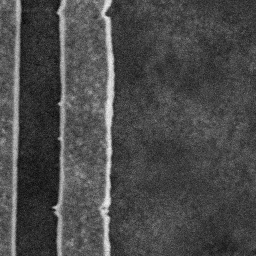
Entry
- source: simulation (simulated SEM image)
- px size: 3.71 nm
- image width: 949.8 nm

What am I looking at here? one or a few lines or trenches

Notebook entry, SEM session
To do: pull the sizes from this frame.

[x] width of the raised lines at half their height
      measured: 178 nm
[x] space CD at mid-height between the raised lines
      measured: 0.168 micrometres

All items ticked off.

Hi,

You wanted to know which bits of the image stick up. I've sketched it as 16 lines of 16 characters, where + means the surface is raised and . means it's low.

+...+++.........
+...+++.........
+...+++.........
+...+++.........
+...+++.........
+...+++.........
+...+++.........
+...+++.........
+...+++.........
+...+++.........
+...+++.........
+...+++.........
+...+++.........
+...+++.........
+...+++.........
+...+++.........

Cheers